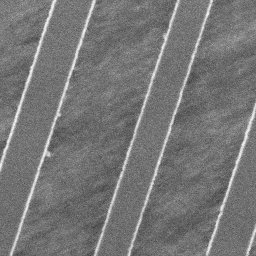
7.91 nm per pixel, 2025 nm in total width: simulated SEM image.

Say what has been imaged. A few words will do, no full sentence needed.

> lines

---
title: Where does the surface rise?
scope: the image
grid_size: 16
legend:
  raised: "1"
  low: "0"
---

0001110000011000
0001100000011000
0001100000110000
0011100000110000
0011000000110000
0011000001100000
0111000001100000
0110000001100000
0110000011100001
1110000011000001
1110000011000001
1100000111000011
1100000110000011
1100000110000011
1000001110000111
1000001100000111